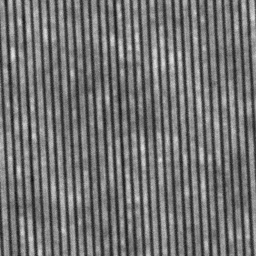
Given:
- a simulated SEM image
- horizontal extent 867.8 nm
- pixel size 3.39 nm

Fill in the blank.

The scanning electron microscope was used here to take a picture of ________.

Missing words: parallel lines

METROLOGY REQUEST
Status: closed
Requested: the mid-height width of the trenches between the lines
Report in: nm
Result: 12.3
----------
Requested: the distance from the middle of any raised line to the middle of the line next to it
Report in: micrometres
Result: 0.0282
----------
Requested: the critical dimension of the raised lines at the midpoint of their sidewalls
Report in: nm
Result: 14.8